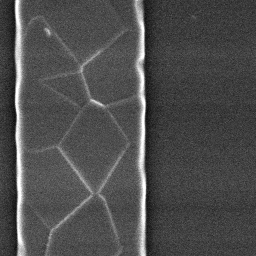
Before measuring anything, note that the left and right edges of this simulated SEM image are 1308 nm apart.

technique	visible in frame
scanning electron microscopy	wiring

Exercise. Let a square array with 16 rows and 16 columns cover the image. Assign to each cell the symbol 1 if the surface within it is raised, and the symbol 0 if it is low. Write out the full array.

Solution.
0111111110000000
0111111110000000
0111111110000000
0111111110000000
0111111110000000
0111111110000000
0111111110000000
0111111110000000
0111111110000000
0111111110000000
0111111110000000
0111111110000000
0111111110000000
0111111110000000
0111111110000000
0111111110000000